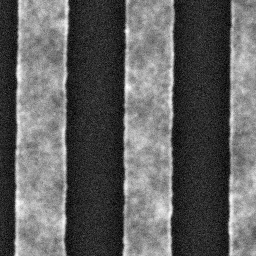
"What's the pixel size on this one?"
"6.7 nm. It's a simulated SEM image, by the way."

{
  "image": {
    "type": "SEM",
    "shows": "lines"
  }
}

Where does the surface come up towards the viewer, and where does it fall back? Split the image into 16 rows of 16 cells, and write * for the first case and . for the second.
.***....***...**
.***....***...**
.***....***...**
.***....***...**
.***....***...**
.***....***...**
.***....***...**
.***....***...**
.***....***...**
.***....***...**
.***....***...**
.***....***...**
.***....***...**
.***....***...**
.***....***...**
.***....***...**